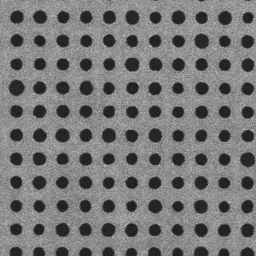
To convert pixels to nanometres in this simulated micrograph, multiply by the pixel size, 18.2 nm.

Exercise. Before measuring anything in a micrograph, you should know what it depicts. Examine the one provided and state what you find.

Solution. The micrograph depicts a regular array of holes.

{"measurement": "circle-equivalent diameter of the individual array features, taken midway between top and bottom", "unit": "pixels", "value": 12.6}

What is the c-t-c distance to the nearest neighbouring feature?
417 nanometers